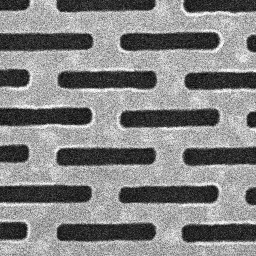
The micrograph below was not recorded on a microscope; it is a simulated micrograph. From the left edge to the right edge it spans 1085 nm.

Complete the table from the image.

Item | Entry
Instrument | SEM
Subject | holes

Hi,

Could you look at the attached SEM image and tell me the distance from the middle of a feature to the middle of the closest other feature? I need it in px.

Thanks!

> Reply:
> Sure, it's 73.6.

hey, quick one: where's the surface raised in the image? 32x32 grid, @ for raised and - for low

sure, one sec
----@@@------------@@@@---------
@@@@@@@@--@@@@@-@@@@@@@@-@@@@@--
@@@@@@@@@@@@@@@@@@@@@@@@@@@@@@@@
@@@@@@@@@@@@@@@@@@@@@@@@@@@@@@@@
-----------@@@@------------@@@@-
------------@@@------------@@@@-
@@@@@@@@@@@@@@@@-@@@@@@@@@@@@@@@
@@@@@@@@@@@@@@@@@@@@@@@@@@@@@@@@
@@@@@@@@@@@@@@@@@@@@@@@@@@@@@@@@
----@@@------------@@@@---------
---@@@@------------@@@@---------
@@@@@@@@@@@@@@@@@@@@@@@@@@@@@@@@
@@@@@@@@@@@@@@@@@@@@@@@@@@@@@@@@
----@@@@---@@@@@@@@@@@@@@@@@@@@@
-----------@@@@------------@@@@-
-----------@@@@------------@@@@-
@@@@@@@@@@@@@@@@@@@@@@@@@@@@@@@@
@@@@@@@@@@@@@@@@@@@@@@@@@@@@@@@@
---@@@@@--@@-----@@@@@@@--@-----
----@@@-------------@@@---------
@@@@@@@------------@@@@---------
@@@@@@@@@@@@@@@@@@@@@@@@@@@@@@@@
@@@@@@@@@@@@@@@@@@@@@@@@@@@@@@@@
-----------@@@@------------@@@@@
-----------@@@@------------@@@@-
@@@@@@@@@@@@@@@@@@@@@@-@@@@@@@@-
@@@@@@@@@@@@@@@@@@@@@@@@@@@@@@@@
@@@@@@@@@@@@@@@@@@@@@@@@@@@@@@@@
---@@@@------------@@@@---------
---@@@@------------@@@@---------
@@@@@@@@@@@@@@@@@@@@@@@@@@@@@@@@
@@@@@@@@@@@@@@@@@@@@@@@@@@@@@@@@